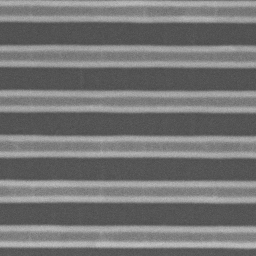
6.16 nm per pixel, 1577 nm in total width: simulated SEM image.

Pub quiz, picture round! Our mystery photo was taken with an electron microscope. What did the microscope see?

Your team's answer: wiring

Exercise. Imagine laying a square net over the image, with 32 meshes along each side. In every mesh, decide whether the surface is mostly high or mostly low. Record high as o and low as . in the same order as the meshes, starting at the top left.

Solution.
oooooooooooooooooooooooooooooooo
oooooooooooooooooooooooooooooooo
..............................oo
................................
................................
................................
oooooooooooooooooooooooooooooooo
oooooooooooooooooooooooooooooooo
................................
................................
................................
................................
oooooooooooooooooooooooooooooooo
oooooooooooooooooooooooooooooooo
................................
................................
................................
oooooooooooooooooooooooooooooooo
oooooooooooooooooooooooooooooooo
................................
................................
................................
................................
oooooooooooooooooooooooooooooooo
oooooooooooooooooooooooooooooooo
................................
................................
................................
................................
oooooooooooooooooooooooooooooooo
oooooooooooooooooooooooooooooooo
................................